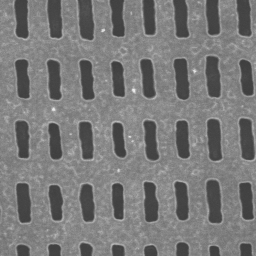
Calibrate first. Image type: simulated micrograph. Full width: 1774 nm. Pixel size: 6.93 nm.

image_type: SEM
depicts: a regular array of holes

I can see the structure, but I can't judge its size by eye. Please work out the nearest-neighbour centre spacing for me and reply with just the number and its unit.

218 nm